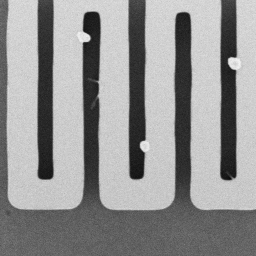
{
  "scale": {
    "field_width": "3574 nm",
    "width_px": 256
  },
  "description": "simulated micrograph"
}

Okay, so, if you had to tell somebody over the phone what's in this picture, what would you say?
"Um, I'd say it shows groups of lines, slits or small figures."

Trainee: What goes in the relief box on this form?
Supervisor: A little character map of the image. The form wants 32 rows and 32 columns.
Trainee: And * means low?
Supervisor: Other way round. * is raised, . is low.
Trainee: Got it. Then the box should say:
.****..*********..**********..**
.****..****.****..**********..**
.****..***...***..****..****..**
.****..***...***..****..****..**
.****..****..***..****..****..**
.****..****..***..****..****..**
.****..***...***..****..****..**
.****..***...***..****..****.***
.****..***..****..****..****.***
.****..***..****..****..****..**
.****..***..****..****..****..**
.****..***..****..****..****..**
.****..***..****..****..****..**
.****..***..****..****..****..**
.****..***..****..****..****..**
.****..***..****..****..****..**
.****..***..****..****..****..**
.****..***..****..****..****..**
.****..***..****..****..****..**
.****..***..****..****..****..**
.****..***..****..****..****..**
.****..****.****..****..****..**
.**********.**********..********
.*********..**********..********
.*********...*********..********
..********...********...********
................................
................................
................................
................................
................................
................................